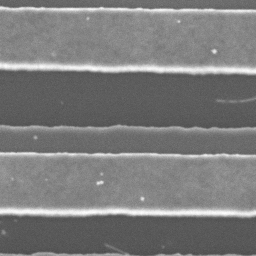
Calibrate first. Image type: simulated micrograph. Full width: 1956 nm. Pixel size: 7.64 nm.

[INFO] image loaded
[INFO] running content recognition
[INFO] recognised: lines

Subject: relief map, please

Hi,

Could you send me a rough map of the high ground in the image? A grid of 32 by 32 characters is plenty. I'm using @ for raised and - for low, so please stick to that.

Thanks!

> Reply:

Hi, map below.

--------------------------------
@@@@@@@@@@@@@@@@@@@@@@@@@@@@@@@@
@@@@@@@@@@@@@@@@@@@@@@@@@@@@@@@@
@@@@@@@@@@@@@@@@@@@@@@@@@@@@@@@@
@@@@@@@@@@@@@@@@@@@@@@@@@@@@@@@@
@@@@@@@@@@@@@@@@@@@@@@@@@@@@@@@@
@@@@@@@@@@@@@@@@@@@@@@@@@@@@@@@@
@@@@@@@@@@@@@@@@@@@@@@@@@@@@@@@@
@@@@@@@@@@@@@@@@@@@@@@@@@@@@@@@@
--------------------------------
--------------------------------
--------------------------------
--------------------------------
--------------------------------
--------------------------------
--------------------------------
--------------------------------
--------------------------------
--------------------------------
@@@@@@@@@@@@@@@@@@@@@@@@@@@@@@@@
@@@@@@@@@@@@@@@@@@@@@@@@@@@@@@@@
@@@@@@@@@@@@@@@@@@@@@@@@@@@@@@@@
@@@@@@@@@@@@@@@@@@@@@@@@@@@@@@@@
@@@@@@@@@@@@@@@@@@@@@@@@@@@@@@@@
@@@@@@@@@@@@@@@@@@@@@@@@@@@@@@@@
@@@@@@@@@@@@@@@@@@@@@@@@@@@@@@@@
@@@@@@@@@@@@@@@@@@@@@@@@@@@@@@@@
--------------------------------
--------------------------------
--------------------------------
--------------------------------
--------------------------------